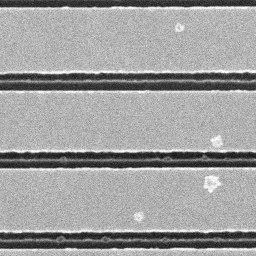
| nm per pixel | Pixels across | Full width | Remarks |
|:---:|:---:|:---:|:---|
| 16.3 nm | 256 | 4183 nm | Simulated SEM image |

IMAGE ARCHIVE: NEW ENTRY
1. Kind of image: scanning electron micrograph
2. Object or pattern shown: lines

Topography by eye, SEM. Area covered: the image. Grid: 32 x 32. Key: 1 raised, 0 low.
00000000000000000000000000000000
11111111111111111111111111111111
11111111111111111111111111111111
11111111111111111111111111111111
11111111111111111111111111111111
11111111111111111111111111111111
11111111111111111111111111111111
11111111111111111111111111111111
11111111111111111111111111111111
00000000000000000000000000000000
00000000000000000000000000000000
11111111111111111111111111111111
11111111111111111111111111111111
11111111111111111111111111111111
11111111111111111111111111111111
11111111111111111111111111111111
11111111111111111111111111111111
11111111111111111111111111111111
11111111111111111111111111111111
00000000000000000000000000000000
00000000000000000000000000000000
11111111111111111111111111111111
11111111111111111111111111111111
11111111111111111111111111111111
11111111111111111111111111111111
11111111111111111111111111111111
11111111111111111111111111111111
11111111111111111111111111111111
11111111111111111111111111111111
00000000000000000000000000000000
00000000000000000000000000000000
11111111111111111111111111111111